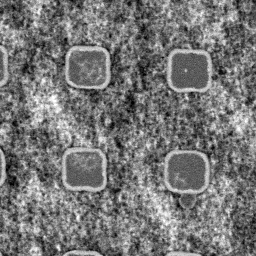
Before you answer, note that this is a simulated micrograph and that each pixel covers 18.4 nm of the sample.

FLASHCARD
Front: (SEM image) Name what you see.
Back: raised bodies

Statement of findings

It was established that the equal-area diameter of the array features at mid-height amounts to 45.1 px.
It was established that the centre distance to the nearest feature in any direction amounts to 1870 nanometers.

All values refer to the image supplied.